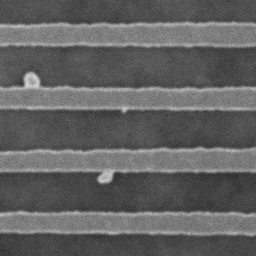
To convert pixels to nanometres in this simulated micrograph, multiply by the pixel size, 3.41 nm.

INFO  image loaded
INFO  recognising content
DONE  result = lines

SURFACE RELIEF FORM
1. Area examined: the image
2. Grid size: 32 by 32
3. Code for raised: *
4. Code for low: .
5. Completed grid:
................................
................................
................................
********************************
********************************
********************************
................................
................................
................................
...*............................
...**...........................
********************************
********************************
**.*****************************
................................
................................
................................
................................
................................
********************************
********************************
............***.................
.............*..................
................................
................................
................................
..*.....**......................
********************************
********************************
................................
................................
................................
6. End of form